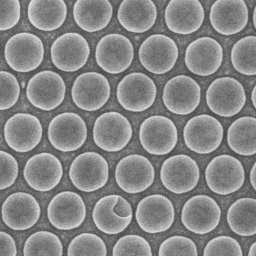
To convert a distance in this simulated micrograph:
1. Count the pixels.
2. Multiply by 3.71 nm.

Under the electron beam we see a regular array of raised bodies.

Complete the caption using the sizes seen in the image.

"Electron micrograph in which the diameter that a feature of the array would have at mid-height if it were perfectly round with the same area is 142 nm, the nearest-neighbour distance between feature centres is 164 nanometres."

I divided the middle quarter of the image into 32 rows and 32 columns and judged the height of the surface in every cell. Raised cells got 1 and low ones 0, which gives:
11111000011111110000111111100001
11100000001111100000011111000001
00000111100000000111000000000000
00011111110000011111100000001111
00011111111000111111110000111111
00111111111000111111111001111111
00111111111000111111111001111111
00111111111000111111111001111111
00111111111001111111111001111111
00011111110000111111110001111111
00011111100000011111100000111111
00000011000000001111000000111111
11000000001111000000000000000110
11110000011111100000011110000000
11111000111111110000111111100001
11111000111111111001111111110001
11111101111111111001111111110011
11111101111111111001111111110011
11111000111111110001111111110011
11111000111111110001111111110011
11110000011111100000111111100001
10000000001111000000011111100000
00001111000000000000000000000000
00011111110000011111000000111110
00111111110000111111100001111111
00111111111001111111110001111111
00111111111001111111110001111111
01111111111001111111110011111111
00111111111001111111110011111111
00111111110001111111110001111111
00011111110000111111100001111111
00001110000000011111000000111111